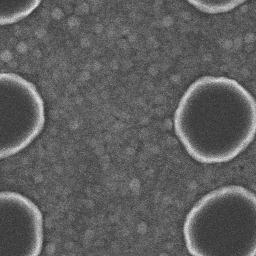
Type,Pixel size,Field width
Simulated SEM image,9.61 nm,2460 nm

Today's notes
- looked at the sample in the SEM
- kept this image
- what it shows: raised bodies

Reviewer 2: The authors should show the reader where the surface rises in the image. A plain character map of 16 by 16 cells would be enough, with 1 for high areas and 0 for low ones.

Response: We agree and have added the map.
1100000000000100
0000000000000000
0000000000000000
0000000000000000
0000000000000000
1100000000001110
1110000000011111
1110000000011111
1100000000011111
1000000000001110
0000000000000000
0000000000000000
1100000000000111
1100000000001111
1100000000001111
1100000000001111